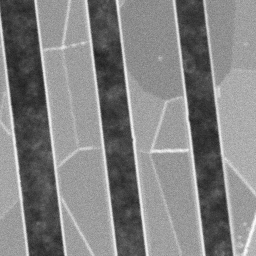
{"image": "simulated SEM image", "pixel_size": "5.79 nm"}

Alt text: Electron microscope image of one or a few lines or trenches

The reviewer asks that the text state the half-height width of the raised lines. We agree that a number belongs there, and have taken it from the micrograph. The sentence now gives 307 nanometers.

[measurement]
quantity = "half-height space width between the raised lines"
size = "175 nm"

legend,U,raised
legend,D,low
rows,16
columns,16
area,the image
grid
DDUUUDDUUUUDDUUU
DDUUUUDDUUUDDUUU
DDDUUUDDUUUDDUUU
DDDUUUDDUUUDDUUU
DDDUUUDDUUUDDUUU
UDDUUUDDUUUDDUUU
UDDUUUDDUUUUDDUU
UDDUUUDDUUUUDDUU
UDDUUUDDUUUUDDUU
UDDUUUUDUUUUDDUU
UDDUUUUDDUUUDDUU
UDDDUUUDDUUUDDUU
UDDDUUUDDUUUDDUU
UDDDUUUDDUUUDDUU
UUDDUUUDDUUUUDUU
UUDDUUUDDUUUUDDU